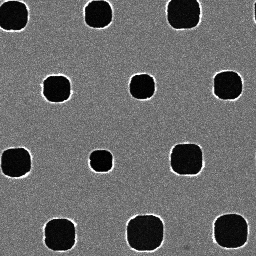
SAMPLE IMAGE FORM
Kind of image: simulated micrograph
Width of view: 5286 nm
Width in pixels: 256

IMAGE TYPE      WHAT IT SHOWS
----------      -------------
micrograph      a regular array of holes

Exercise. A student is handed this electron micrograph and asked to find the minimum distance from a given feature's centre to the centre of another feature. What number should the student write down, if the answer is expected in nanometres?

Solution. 1740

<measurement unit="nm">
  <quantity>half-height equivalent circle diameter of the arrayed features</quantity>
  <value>639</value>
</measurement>